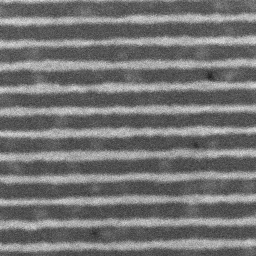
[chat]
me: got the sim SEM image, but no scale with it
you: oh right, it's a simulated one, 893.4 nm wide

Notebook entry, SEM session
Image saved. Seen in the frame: parallel lines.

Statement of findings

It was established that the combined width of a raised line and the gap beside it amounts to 78.8 nm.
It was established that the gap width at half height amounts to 61.9 nanometers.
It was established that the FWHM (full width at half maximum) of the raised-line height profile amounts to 0.0183 microns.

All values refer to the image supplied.